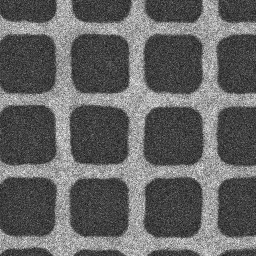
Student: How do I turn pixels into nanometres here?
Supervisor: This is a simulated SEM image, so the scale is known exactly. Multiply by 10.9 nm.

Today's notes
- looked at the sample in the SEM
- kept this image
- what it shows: holes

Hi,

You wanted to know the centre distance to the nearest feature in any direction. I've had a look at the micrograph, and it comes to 778 nm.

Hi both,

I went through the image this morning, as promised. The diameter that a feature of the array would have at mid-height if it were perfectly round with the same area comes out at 0.702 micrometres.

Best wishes